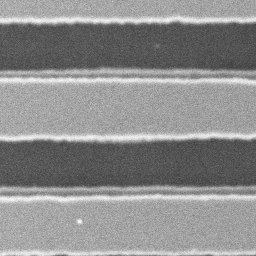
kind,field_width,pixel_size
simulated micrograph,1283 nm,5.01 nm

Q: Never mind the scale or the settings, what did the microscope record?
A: lines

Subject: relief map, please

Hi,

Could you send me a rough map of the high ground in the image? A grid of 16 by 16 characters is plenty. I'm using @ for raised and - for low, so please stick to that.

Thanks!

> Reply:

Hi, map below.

@@@@@@@@@@@@@@@@
----------------
----------------
----------------
@--@@-@@@-@@@@@-
@@@@@@@@@@@@@@@@
@@@@@@@@@@@@@@@@
@@@@@@@@@@@@@@@@
@@@@@@@@@@@@@@@@
----------------
----------------
----------------
@@@@@@@@@@@@@@@@
@@@@@@@@@@@@@@@@
@@@@@@@@@@@@@@@@
@@@@@@@@@@@@@@@@